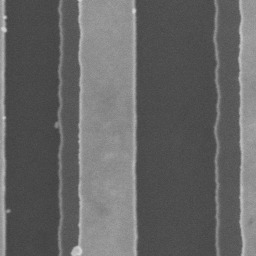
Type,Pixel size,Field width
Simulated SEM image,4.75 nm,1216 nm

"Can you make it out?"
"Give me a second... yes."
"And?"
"lines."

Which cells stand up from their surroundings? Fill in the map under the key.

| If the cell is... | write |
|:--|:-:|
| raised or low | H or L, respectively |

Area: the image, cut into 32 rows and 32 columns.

LLLLLLLLHHHHHHHHHLLLLLLLLLLHHHHH
HLLLLLLLHHHHHHHHHLLLLLLLLLLHHHHH
HLLLLLLLHHHHHHHHHLLLLLLLLLLHHHHH
HLLLLLLLHHHHHHHHHLLLLLLLLLLHHHHH
LLLLLLLLHHHHHHHHHLLLLLLLLLLHHHHH
LLLLLLLLHHHHHHHHHLLLLLLLLLLHHHHH
LLLLLLLLHHHHHHHHHLLLLLLLLLLHHHHH
LLLLLLLLHHHHHHHHHLLLLLLLLLLHHHHH
LLLLLLLHHHHHHHHHHLLLLLLLLLLHHHHH
LLLLLLLLHHHHHHHHHLLLLLLLLLLHHHHH
LLLLLLLLHHHHHHHHHLLLLLLLLLLHHHHH
LLLLLLLHHHHHHHHHHLLLLLLLLLLHHHHH
LLLLLLLLHHHHHHHHHLLLLLLLLLLHHHHH
LLLLLLLLHHHHHHHHHLLLLLLLLLLHHHHH
HLLLLLLHHHHHHHHHHLLLLLLLLLLHHHHH
HLLLLLLLHHHHHHHHHLLLLLLLLLLHHHHH
HLLLLLLLHHHHHHHHHLLLLLLLLLLHHHHH
LLLLLLLLHHHHHHHHHLLLLLLLLLLHHHHH
LLLLLLLLHHHHHHHHHLLLLLLLLLLHHHHH
HLLLLLLHHHHHHHHHHLLLLLLLLLLHHHHH
HLLLLLLLHHHHHHHHHLLLLLLLLLLHHHHH
HLLLLLLLHHHHHHHHHLLLLLLLLLLHHHHH
LLLLLLLLHHHHHHHHHLLLLLLLLLLHHHHH
HLLLLLLLHHHHHHHHHLLLLLLLLLLHHHHH
LLLLLLLLHHHHHHHHHLLLLLLLLLLHHHHH
LLLLLLLLHHHHHHHHHLLLLLLLLLLHHHHH
HLLLLLLLHHHHHHHHHLLLLLLLLLLHHHHH
HLLLLLLLHHHHHHHHHLLLLLLLLLLHHHHH
HLLLLLLLHHHHHHHHHLLLLLLLLLLHHHHH
HLLLLLLHHHHHHHHHHLLLLLLLLLLHHHHH
HLLLLLLHHHHHHHHHHLLLLLLLLLLHHHHH
HLLLLLLLHHHHHHHHHLLLLLLLLLLHHHHH